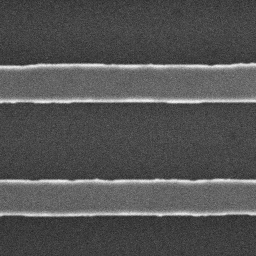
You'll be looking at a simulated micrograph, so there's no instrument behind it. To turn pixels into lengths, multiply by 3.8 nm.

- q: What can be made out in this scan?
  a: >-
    lines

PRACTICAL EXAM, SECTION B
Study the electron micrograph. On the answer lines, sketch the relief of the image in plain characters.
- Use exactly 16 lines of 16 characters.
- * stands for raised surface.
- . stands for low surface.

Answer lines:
................
................
................
................
****************
****************
................
................
................
................
................
****************
****************
................
................
................